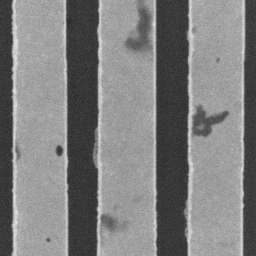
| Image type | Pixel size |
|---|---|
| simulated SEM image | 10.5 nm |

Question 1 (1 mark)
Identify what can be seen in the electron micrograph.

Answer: lines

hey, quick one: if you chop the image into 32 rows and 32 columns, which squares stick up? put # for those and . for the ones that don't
..######....#######.....#######.
..######....#######.....######..
..######....#######.....#######.
..######....#######.....######..
..######....#######.....######..
..######....#######.....#######.
..######....#######.....#######.
..######....#######.....######..
..######....#######.....######..
..######....#######.....######..
..######....#######.....######..
..######....#######.....######..
..######....#######.....######..
..######....#######.....######..
..######....#######.....######..
..######....#######.....######..
..######....#######.....######..
..######....#######.....######..
..######....#######.....######..
..######....#######.....######..
..######....#######.....######..
..######....#######.....######..
..######....#######.....######..
..######....#######.....######..
..######....#######.....######..
..######....#######.....######..
..######....#######.....######..
..######....#######.....######..
..######....#######.....######..
..######....#######....#######..
..######....#######....#######..
..######....########....######..